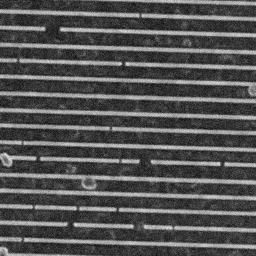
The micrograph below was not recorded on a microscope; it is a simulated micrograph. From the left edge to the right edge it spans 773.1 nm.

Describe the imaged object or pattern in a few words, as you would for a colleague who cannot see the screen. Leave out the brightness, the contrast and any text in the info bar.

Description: parallel lines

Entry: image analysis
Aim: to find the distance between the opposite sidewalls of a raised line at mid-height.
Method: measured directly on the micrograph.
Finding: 10.6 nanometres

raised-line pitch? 49.1 nanometres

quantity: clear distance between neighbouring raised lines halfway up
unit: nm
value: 40